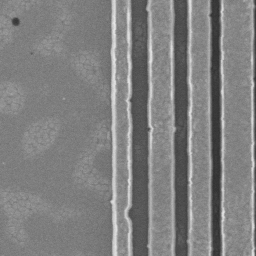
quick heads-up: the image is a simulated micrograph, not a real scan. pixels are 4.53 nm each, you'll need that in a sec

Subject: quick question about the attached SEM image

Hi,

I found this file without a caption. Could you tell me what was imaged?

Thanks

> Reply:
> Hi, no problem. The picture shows parallel lines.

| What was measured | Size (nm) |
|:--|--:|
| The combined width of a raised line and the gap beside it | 174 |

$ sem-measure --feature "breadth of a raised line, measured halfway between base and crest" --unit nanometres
106